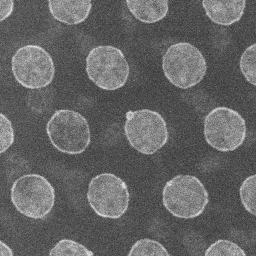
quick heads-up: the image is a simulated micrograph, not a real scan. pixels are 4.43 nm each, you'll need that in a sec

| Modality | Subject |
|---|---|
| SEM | a regular array of raised bodies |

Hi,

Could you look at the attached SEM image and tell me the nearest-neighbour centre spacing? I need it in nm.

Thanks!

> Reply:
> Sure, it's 328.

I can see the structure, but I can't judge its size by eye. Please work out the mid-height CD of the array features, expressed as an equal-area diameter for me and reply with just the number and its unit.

42.3 px